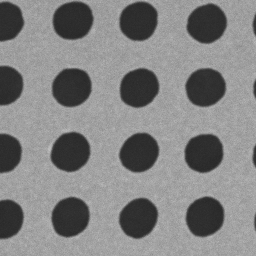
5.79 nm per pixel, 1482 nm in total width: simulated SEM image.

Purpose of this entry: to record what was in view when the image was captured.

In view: a regular array of holes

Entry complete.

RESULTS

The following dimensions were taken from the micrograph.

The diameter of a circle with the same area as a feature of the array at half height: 228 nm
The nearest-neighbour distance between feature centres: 374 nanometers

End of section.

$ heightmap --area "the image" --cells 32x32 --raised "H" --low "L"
LLHHHHHHLLLHHHHHLLLHHHHHHHHHHHHH
LLLHHHHLLLLHHHHLLLLLHHHHLLLLHHHH
LLLHHHHLLLLLHHHLLLLLHHHHLLLLHHHH
LLLHHHHLLLLHHHHLLLLLHHHLLLLLHHHH
LLHHHHHLLLLHHHHHLLLHHHHHLLLLHHHH
HHHHHHHHHHHHHHHHHHHHHHHHHHHHHHHH
HHHHHHHHHHHHHHHHHHHHHHHHHHHHHHHH
HHHHHHHHHHHHHHHHHHHHHHHHHHHHHHHH
LLHHHHHHHHHHHHHHHHHHHHHHHLHHHHHH
LLLHHHHLLLLHHHHHLLLHHHHHLLLLHHHH
LLLHHHHLLLLHHHHLLLLLHHHLLLLLHHHH
LLLHHHHLLLLHHHHLLLLLHHHLLLLLHHHH
LLHHHHHLLLLHHHHLLLLHHHHHLLLHHHHH
HHHHHHHHHHHHHHHHHHHHHHHHHHHHHHHH
HHHHHHHHHHHHHHHHHHHHHHHHHHHHHHHH
HHHHHHHHHHHHHHHHHHHHHHHHHHHHHHHH
HHHHHHHHHHHHHHHHHHHHHHHHHHHHHHHH
LLHHHHHLLLLHHHHHLLLHHHHHLLLHHHHH
LLLHHHHLLLLHHHHLLLLLHHHLLLLLHHHH
LLLHHHLLLLLHHHHLLLLLHHHLLLLLHHHH
LLHHHHHLLLLHHHHLLLLHHHHLLLLLHHHH
LHHHHHHHHHHHHHHHHHHHHHHHHLHHHHHH
HHHHHHHHHHHHHHHHHHHHHHHHHHHHHHHH
HHHHHHHHHHHHHHHHHHHHHHHHHHHHHHHH
HHHHHHHHHHHHHHHHHHHHHHHHHHHHHHHH
LLHHHHHLLLLHHHHHLLLHHHHHLLLLHHHH
LLLHHHHLLLLHHHHLLLLLHHHLLLLLHHHH
LLLHHHLLLLLHHHHLLLLLHHHLLLLLHHHH
LLLHHHHLLLLHHHHLLLLHHHHLLLLLHHHH
LLHHHHHHLHHHHHHHLLHHHHHHHLHHHHHH
HHHHHHHHHHHHHHHHHHHHHHHHHHHHHHHH
HHHHHHHHHHHHHHHHHHHHHHHHHHHHHHHH